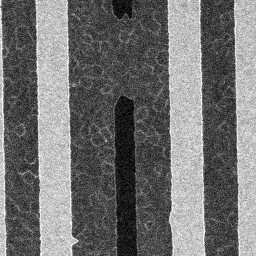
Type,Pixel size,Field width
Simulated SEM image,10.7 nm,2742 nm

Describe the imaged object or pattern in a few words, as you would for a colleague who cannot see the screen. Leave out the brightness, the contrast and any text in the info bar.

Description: one or a few lines or trenches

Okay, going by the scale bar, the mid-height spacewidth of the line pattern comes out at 380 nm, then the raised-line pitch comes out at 707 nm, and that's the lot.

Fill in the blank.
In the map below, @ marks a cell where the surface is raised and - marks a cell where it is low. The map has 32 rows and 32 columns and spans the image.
-----@@@------@@@----@@@@----@@@
-----@@@------@@@----@@@@----@@@
-----@@@-------------@@@@----@@@
-----@@@-------------@@@@----@@@
-----@@@-------------@@@@----@@@
-----@@@-------------@@@@----@@@
-----@@@-------------@@@@----@@@
-----@@@@------------@@@@----@@@
-----@@@@------------@@@@-----@@
-----@@@-------------@@@@-----@@
-----@@@@------------@@@@-----@@
-----@@@@------------@@@@-----@@
-----@@@@------@-----@@@@-----@@
-----@@@@-----@@@----@@@@-----@@
-----@@@@-----@@@----@@@@-----@@
-----@@@@-----@@@----@@@@-----@@
-----@@@@-----@@@----@@@@-----@@
-----@@@@-----@@@----@@@@-----@@
-----@@@@-----@@@----@@@@-----@@
-----@@@@-----@@@----@@@@-----@@
@----@@@@-----@@@----@@@@-----@@
@----@@@@-----@@@----@@@@-----@@
-----@@@@-----@@@-----@@@-----@@
@----@@@@-----@@@-----@@@-----@@
@----@@@@-----@@@----@@@@-----@@
@----@@@@------@@-----@@@-----@@
@----@@@@-----@@@----@@@@-----@@
@----@@@@------@@----@@@@-----@@
@----@@@@------@@----@@@@@----@@
@----@@@@------@@-----@@@@----@@
@----@@@@------@@-----@@@-----@@
@----@@@@------@@-----@@@@----@@